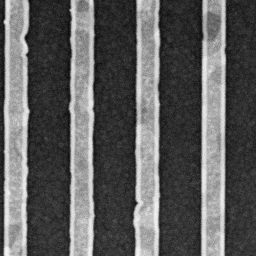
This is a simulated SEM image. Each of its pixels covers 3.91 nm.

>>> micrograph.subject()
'one or a few lines or trenches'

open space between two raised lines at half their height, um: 0.185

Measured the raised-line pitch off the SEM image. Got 65.9 pixels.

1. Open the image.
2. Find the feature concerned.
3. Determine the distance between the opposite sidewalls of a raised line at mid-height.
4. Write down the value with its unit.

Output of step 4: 0.0726 micrometres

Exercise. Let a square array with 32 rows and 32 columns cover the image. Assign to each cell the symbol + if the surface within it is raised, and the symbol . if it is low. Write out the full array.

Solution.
.++......++......+++......++....
.++......++......+++......++....
.++......++......+++......++....
.++......++......+++......++....
.++......++......+++......++....
.++......++......+++......++....
.++......++......+++......++....
.++......++......+++......++....
.++......++......+++......++....
.++......++......+++......++....
.++......++......++.......++....
.++......++......++.......++....
.++......++......+++......++....
.++......++......+++......++....
.++......++......+++......++....
.++......++......+++......++....
.++......++......+++......++....
.++......++......+++......++....
.++......++......+++......++....
.++......++......+++......++....
.++......++......+++......++....
.++......++......+++......++....
.++......++......+++......++....
.++......++......+++......++....
.++......++......+++......++....
.++......++......+++......++....
.++......++......+++......++....
.++......++......++.......++....
.++......++......+++......++....
.++......++......+++......++....
.++......++......+++......++....
.++......++......++.......++....